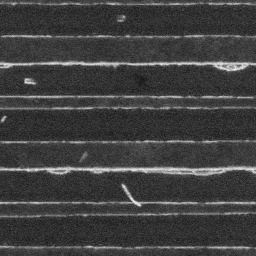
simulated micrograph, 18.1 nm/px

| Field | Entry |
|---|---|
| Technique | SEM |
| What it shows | lines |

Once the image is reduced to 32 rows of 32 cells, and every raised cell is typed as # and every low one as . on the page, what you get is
................................
................................
................................
................................
................................
################################
################################
################################
................................
................................
................................
................................
################################
############..###.###..#####....
................................
................................
................................
................................
################################
################################
################################
................................
................................
................................
................................
################################
################################
................................
................................
................................
................................
################################